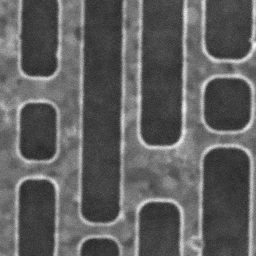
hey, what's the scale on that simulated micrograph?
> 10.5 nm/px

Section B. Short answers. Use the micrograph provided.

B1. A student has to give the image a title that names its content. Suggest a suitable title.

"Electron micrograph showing one or a few lines or trenches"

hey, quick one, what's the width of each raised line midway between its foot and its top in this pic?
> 203 nm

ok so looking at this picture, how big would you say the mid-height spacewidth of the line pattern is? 433 nm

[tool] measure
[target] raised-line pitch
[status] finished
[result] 649 nanometres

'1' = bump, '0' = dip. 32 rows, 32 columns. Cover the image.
11100001110000001100000110000000
11100001110000011100000110000000
11000001110000011100000110000000
11000000110000011100000110000000
11000000110000001100000110000000
11000000110000001000000110000000
11000001110000011000000111000001
11000001110000011000000111100011
11100001110000011000000111111111
11100001110000011000000111100111
11111111110000011000000111000001
11111111110000011000000110000000
11111111110000011000000110000000
11100001110000011000000110000000
11000001110000011000000110000001
11000001110000011000000111000001
11000001110000011000000111100011
11000001110000011100000111111111
11000001110000011111111111000011
11100001110000011111111110000001
11111111110000011111111110000001
11111111110000011111111110000001
11100011110000011111111110000001
11000001110000011111111110000001
11000001110000011111111110000001
11000001110000011100001110000001
11000001110000011000000110000001
11000001111000011000000110000001
11000001111111111000000110000001
11000001111111111000000110000001
11000001110000011000000110000001
11000001110000011000000110000001